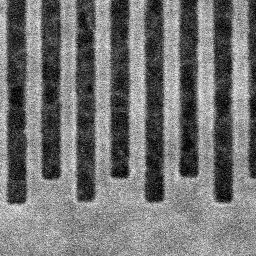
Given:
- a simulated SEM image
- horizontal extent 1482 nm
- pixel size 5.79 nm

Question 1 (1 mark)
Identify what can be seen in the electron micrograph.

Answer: parallel lines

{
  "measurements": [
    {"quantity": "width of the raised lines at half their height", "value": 80.3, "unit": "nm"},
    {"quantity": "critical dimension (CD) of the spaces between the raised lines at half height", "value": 19.9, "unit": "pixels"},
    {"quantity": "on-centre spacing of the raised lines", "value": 199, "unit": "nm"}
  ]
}